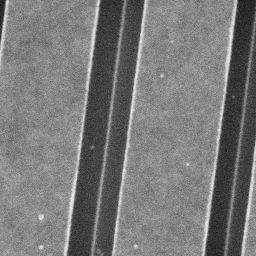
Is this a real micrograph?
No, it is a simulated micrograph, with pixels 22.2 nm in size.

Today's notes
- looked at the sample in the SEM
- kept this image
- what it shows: lines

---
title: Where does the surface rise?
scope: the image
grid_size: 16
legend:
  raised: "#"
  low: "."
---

######...######.
######...######.
######...######.
######...#####..
######..######..
######..######..
#####...######..
#####...######..
#####...######..
#####...######..
#####...#####...
#####...#####...
#####..######...
####...######..#
####...######..#
####...######..#